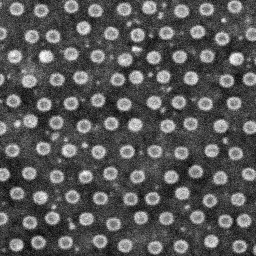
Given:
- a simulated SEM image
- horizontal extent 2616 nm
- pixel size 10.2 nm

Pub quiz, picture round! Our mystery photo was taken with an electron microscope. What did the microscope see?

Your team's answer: a regular array of raised bodies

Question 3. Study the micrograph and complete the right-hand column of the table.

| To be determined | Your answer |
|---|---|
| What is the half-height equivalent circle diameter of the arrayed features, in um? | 0.125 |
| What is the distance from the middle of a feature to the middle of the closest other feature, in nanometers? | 246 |